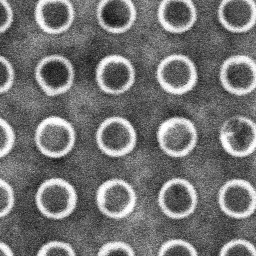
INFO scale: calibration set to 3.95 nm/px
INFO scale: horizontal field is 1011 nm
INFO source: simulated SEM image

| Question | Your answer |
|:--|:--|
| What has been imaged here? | a regular array of raised bodies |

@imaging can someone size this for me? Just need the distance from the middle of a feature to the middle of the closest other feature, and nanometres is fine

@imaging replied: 241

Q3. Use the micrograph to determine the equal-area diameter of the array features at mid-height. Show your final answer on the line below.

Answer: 139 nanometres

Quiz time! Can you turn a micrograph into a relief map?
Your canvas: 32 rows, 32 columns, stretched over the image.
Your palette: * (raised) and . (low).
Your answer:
*....****....***....****....****
*....****...*****...****....****
*....****...****....****....****
*.....**.....***.....**......**.
................................
................................
................................
......**.....**......**......**.
*....****...****....****....****
*....****...****....****....****
*....****....***....****....****
......*.......*.................
................................
................................
................................
*....***.....***.....***......*.
*....****...*****...****.....***
*....****...*****...****....****
*....****....***.....***....****
................................
................................
................................
................................
*....****....***.....***....***.
*....****...*****...****....****
*....****...****....****....****
*.....**.....***.....***....***.
................................
................................
................................
.....................**......**.
*....****....***....****....****